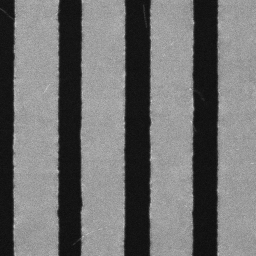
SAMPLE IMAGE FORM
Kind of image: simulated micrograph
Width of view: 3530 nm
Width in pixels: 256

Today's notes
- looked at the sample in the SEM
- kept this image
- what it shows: one or a few lines or trenches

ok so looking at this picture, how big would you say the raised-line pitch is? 934 nm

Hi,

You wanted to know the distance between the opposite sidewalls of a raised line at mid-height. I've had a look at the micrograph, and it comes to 365 nm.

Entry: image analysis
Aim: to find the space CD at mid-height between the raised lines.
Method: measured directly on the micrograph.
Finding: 570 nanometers